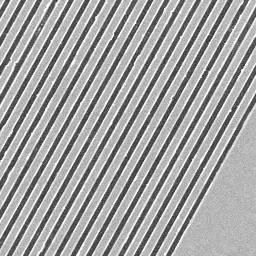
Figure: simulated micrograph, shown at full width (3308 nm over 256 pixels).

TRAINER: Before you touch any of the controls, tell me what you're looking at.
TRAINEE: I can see parallel lines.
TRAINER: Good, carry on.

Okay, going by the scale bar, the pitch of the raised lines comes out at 13.9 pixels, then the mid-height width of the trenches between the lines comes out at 69.2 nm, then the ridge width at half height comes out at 104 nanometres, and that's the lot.